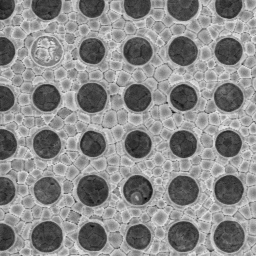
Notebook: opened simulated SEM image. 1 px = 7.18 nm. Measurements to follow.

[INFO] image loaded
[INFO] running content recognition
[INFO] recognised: a regular array of holes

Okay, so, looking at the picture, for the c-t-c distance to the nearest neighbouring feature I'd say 326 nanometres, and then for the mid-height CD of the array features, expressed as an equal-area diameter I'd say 28.8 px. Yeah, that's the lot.